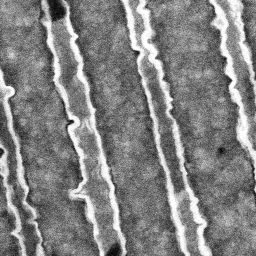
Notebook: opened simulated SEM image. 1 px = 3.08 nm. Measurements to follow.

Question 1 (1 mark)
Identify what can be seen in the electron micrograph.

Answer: one or a few lines or trenches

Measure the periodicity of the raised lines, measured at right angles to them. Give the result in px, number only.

80.3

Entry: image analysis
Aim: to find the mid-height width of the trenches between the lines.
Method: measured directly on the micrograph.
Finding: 177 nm